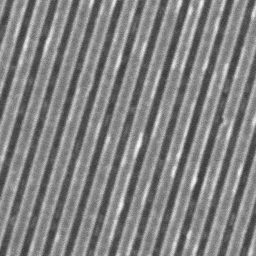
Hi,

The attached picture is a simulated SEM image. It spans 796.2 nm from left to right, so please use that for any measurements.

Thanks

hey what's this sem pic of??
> parallel lines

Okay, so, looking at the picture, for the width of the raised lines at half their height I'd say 38.1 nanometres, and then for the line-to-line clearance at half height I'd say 29.1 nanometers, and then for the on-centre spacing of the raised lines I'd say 0.0656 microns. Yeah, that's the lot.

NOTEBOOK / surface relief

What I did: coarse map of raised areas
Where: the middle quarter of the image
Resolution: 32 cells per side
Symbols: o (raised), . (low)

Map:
ooo..ooo..oooo..ooo...oo...ooo..
oo...ooo..ooo...ooo..ooo...ooo..
oo..ooo...ooo..ooo...ooo..oooo..
oo..ooo...ooo..ooo...ooo..ooo...
o...ooo..ooo...ooo..ooo...ooo..o
o..oooo..ooo..oooo..ooo...ooo..o
o..ooo...ooo..ooo...ooo..ooo...o
o..ooo..ooo...ooo...ooo..ooo..oo
...ooo..ooo...ooo..ooo...ooo..oo
..ooo...ooo..ooo...ooo..oooo..oo
..ooo...oo...ooo...ooo..ooo..ooo
..ooo..ooo...ooo..ooo...ooo..ooo
..oo...ooo..oooo..ooo..oooo..ooo
.ooo...ooo..ooo...ooo..ooo...ooo
.ooo..ooo...ooo..oooo..ooo..ooo.
.ooo..ooo...ooo..ooo...ooo..ooo.
ooo...ooo..ooo...ooo..ooo...ooo.
ooo...oo...ooo...ooo..ooo..oooo.
ooo..ooo...ooo..ooo...ooo..ooo..
oo...ooo..oooo..ooo..oooo..ooo..
oo...ooo..ooo...ooo..ooo...ooo..
oo..ooo...ooo..oooo..ooo..ooo...
oo..ooo..oooo..ooo...ooo..ooo...
o...ooo..ooo...ooo..ooo...ooo..o
o..oooo..ooo...oo...ooo...ooo..o
o..ooo...ooo..ooo...ooo..ooo...o
...ooo..ooo...ooo..oooo..ooo..oo
...ooo..ooo...ooo..ooo...ooo..oo
..ooo...ooo..ooo...ooo..ooo...oo
..ooo..oooo..ooo..oooo..ooo...oo
..ooo..ooo...ooo..ooo...ooo..ooo
.ooo...ooo..ooo...ooo..ooo...ooo